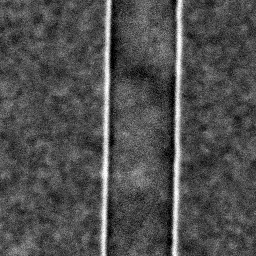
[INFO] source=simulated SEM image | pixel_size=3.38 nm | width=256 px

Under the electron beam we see one or a few lines or trenches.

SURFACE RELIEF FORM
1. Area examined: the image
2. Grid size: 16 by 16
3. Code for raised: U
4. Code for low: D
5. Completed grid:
UUUUUUUDDDDUUUUU
UUUUUUUDDDDUUUUU
UUUUUUUDDDDUUUUU
UUUUUUUDDDDUUUUU
UUUUUUUDDDDUUUUU
UUUUUUUDDDDUUUUU
UUUUUUUDDDDUUUUU
UUUUUUUDDDDUUUUU
UUUUUUUDDDDUUUUU
UUUUUUUDDDDUUUUU
UUUUUUUDDDDUUUUU
UUUUUUUDDDDUUUUU
UUUUUUUDDDDUUUUU
UUUUUUUDDDDUUUUU
UUUUUUUDDDDUUUUU
UUUUUUUDDDDUUUUU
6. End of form